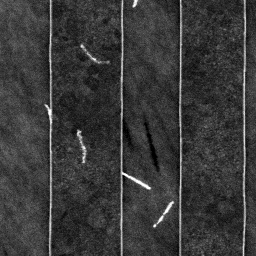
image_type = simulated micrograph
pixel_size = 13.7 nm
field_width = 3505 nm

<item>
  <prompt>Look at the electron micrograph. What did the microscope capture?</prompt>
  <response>wiring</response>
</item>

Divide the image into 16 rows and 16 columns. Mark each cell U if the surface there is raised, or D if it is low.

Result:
DDDUUUUUDDDUUUUD
DDDUUUUUDDDUUUUD
DDDUUUUUDDDUUUUD
DDDUUUUUDDDUUUUD
DDDUUUUUDDDUUUUD
DDDUUUUUDDDUUUUD
DDDUUUUUDDDUUUUD
DDDUUUUUDDDUUUUD
DDDUUUUUDDDUUUUD
DDDUUUUUDDDUUUUD
DDDUUUUUDDDUUUUD
DDDUUUUUDDDUUUUD
DDDUUUUUDDDUUUUD
DDDUUUUUDDDUUUUD
DDDUUUUUDDDUUUUD
DDDUUUUUDDDUUUUD